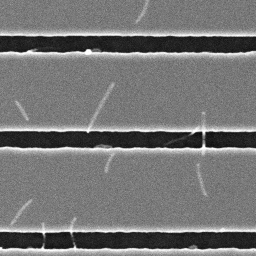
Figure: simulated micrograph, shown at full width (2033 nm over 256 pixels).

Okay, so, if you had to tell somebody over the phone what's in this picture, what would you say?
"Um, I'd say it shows lines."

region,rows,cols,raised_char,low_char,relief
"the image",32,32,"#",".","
################################
################################
################################
################################
................................
................................
.#.##....###...................#
################################
################################
################################
################################
################################
################################
################################
################################
################################
.......................###......
................................
##......#................#......
################################
################################
################################
################################
################################
################################
################################
################################
################################
################################
................................
................................
################################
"